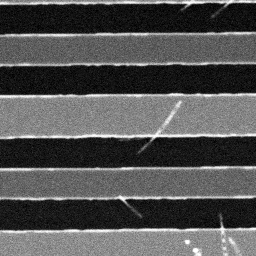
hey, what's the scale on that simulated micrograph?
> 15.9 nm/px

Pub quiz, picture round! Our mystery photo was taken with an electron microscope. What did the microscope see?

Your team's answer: lines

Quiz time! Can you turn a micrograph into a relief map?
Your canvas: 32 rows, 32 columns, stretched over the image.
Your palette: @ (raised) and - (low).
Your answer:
--------------------------------
--------------------------------
--------------------------------
--------------------------------
@@@@@@@@@@@@@@@@@@@@@@@@@@@@@@@@
@@@@@@@@@@@@@@@@@@@@@@@@@@@@@@@@
@@@@@@@@@@@@@@@@@@@@@@@@@@@@@@@@
@@@@@@@@@@@@@@@@@@@@@@@@@@@@@@@@
--------------------------------
--------------------------------
--------------------------------
--------------------------------
@@@@@@@@@@@@@@@@@@@@@@@@@@@@@@@@
@@@@@@@@@@@@@@@@@@@@@@@@@@@@@@@@
@@@@@@@@@@@@@@@@@@@@@@@@@@@@@@@@
@@@@@@@@@@@@@@@@@@@@@@@@@@@@@@@@
@@@@@@@@@@@@@@@@@@@@@@@@@@@@@@@@
--------------------------------
--------------------------------
--------------------------------
--------------------------------
@@@@@@@@@@@@@@@@@@@@@@@@@@@@@@@@
@@@@@@@@@@@@@@@@@@@@@@@@@@@@@@@@
@@@@@@@@@@@@@@@@@@@@@@@@@@@@@@@@
@@@@@@@@@@@@@@@@@@@@@@@@@@@@@@@@
--------------------------------
--------------------------------
--------------------------------
--------------------------------
@@@@@@@@@@@@@@@@@@@@@@@@@@@@@@@@
@@@@@@@@@@@@@@@@@@@@@@@@@@@@@@@@
@@@@@@@@@@@@@@@@@@@@@@@@@@@@@@@@